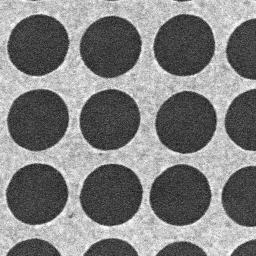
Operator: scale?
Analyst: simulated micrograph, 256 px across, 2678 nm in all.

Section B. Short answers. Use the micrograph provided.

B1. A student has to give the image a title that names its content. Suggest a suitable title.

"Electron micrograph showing a regular array of holes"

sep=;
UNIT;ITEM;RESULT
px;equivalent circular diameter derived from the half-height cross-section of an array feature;62.8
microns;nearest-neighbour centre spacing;0.757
